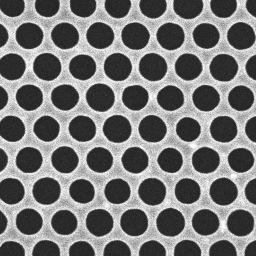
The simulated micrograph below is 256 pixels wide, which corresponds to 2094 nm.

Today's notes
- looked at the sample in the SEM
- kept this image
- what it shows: a regular array of holes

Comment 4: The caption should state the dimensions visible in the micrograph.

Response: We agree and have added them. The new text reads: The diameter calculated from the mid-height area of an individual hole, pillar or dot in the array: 0.221 microns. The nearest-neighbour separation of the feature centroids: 287 nanometres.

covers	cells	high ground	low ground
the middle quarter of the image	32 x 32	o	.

o.......oo.......oo.......oo....
o.......oo.......oo.......oo....
oo......oo.......oo......ooo....
ooo...ooooo.....oooo.....oooo...
oooooooooooooooooooooooooooooooo
..ooooo....ooooo...ooooooo..oooo
...ooo......ooo......ooo.....ooo
....oo.......oo......oo.......oo
....o........o.......oo.......oo
....oo.......oo......oo.......oo
...ooo......ooo.....oooo.....ooo
..ooooo....oooooo..ooooooo..oooo
oooooooooooooooooooooooooooooooo
ooo....oooo.....oooo....oooooo..
oo......oo......ooo......ooo....
o.......oo.......oo.......oo....
o.......oo.......o........oo....
oo......oo.......oo.......oo....
oo.....oooo.....oooo.....oooo...
oooo.ooooooo...oooooo..ooooooooo
oooooooooooooooooooooooooooooooo
...oooo....ooooo....ooooo...oooo
...ooo......ooo......ooo.....ooo
...ooo......oo.......oo.......oo
....oo......ooo......oo.......oo
...ooo......ooo......ooo......oo
..ooooo....oooo.....ooooo....ooo
oooooooooooooooooooooooooooooooo
ooooooooooooooooooooo..ooooooo.o
oo.....oooo.....oooo.....oooo...
oo.....ooo......ooo......ooo....
o.......oo.......oo......ooo....